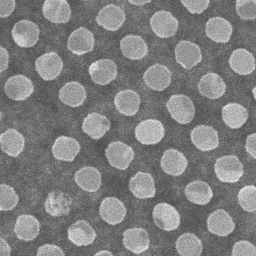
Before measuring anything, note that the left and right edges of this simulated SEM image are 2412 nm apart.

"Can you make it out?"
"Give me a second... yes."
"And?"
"a regular array of raised bodies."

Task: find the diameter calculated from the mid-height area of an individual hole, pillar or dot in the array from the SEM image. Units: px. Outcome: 25.9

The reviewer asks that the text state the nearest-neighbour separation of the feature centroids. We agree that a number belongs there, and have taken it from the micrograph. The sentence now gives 0.356 microns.